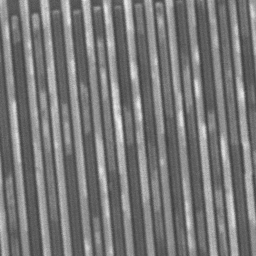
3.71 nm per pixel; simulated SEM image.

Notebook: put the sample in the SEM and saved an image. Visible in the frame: parallel lines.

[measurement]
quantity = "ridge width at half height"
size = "22.2 nanometers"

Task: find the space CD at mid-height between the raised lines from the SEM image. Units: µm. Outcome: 0.0148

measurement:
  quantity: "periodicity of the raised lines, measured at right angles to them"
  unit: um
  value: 0.0385